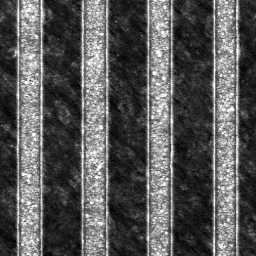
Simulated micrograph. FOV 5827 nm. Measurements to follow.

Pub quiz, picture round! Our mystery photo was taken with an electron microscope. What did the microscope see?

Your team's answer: one or a few lines or trenches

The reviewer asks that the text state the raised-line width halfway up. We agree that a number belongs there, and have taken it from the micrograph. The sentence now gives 956 nanometres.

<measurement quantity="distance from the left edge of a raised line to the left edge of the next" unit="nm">1490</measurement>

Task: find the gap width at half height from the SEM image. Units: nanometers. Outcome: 512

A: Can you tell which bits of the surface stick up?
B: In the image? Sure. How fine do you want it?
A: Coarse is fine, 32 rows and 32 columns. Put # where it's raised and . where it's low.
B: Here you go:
##...#####...######..######...##
##...#####...######..######...##
##...#####...######..######...##
##...#####...######..######...##
##...#####...######..######...##
##...#####...######..######...##
##...#####...######..######...##
##...#####...######..######...##
##...#####...######..######...##
##...#####...######..######...##
##...#####...######..######...##
##...#####...######..######...##
##...#####...######..######...##
##...#####...######..######...##
##...#####...######..######...##
##...#####...######..######...##
##...#####...######..######...##
##...#####...######..######...##
##...#####...######..######...##
##...#####...######..######...##
##...#####...######..######...##
##...#####...######..######...##
##...#####...######..######...##
##...#####...######..######...##
##...#####...######..######...##
##...#####...######..######...##
##...#####...######..######...##
##...#####...######..######...##
##...#####...######..######...##
##...#####...######..######...##
##...#####...######..######...##
##...#####...######..######...##